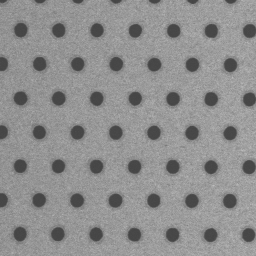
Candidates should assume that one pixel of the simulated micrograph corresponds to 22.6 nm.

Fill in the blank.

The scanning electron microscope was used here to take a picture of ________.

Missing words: a regular array of holes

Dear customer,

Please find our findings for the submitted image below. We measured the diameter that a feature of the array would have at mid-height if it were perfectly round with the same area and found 0.311 microns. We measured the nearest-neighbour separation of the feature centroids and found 859 nm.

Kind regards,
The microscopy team